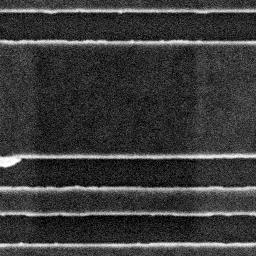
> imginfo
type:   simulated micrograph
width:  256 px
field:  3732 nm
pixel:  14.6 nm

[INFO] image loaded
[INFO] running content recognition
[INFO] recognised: lines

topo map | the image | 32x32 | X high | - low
XXXXXXXXXXXXXXXXXXXXXXXXXXXXXXXX
-----XX-------X----X----XXX-----
--------------------------------
--------------------------------
--------------------------------
XXXXXXXXXXXXXXXXXXXXXXXXXXXXXXXX
XXXXXXXXXXXXXXXXXXXXXXXXXXXXXXXX
XXXXXXXXXXXXXXXXXXXXXXXXXXXXXXXX
XXXXXXXXXXXXXXXXXXXXXXXXXXXXXXXX
XXXXXXXXXXXXXXXXXXXXXXXXXXXXXXXX
XXXXXXXXXXXXXXXXXXXXXXXXXXXXXXXX
XXXXXXXXXXXXXXXXXXXXXXXXXXXXXXXX
XXXXXXXXXXXXXXXXXXXXXXXXXXXXXXXX
XXXXXXXXXXXXXXXXXXXXXXXXXXXXXXXX
XXXXXXXXXXXXXXXXXXXXXXXXXXXXXXXX
XXXXXXXXXXXXXXXXXXXXXXXXXXXXXXXX
XXXXXXXXXXXXXXXXXXXXXXXXXXXXXXXX
XXXXXXXXXXXXXXXXXXXXXXXXXXXXXXXX
XXXXXXXXXXXXXXXXXXXXXXXXXXXXXXXX
XXXXXXXXXXXXXXXXXXXXXXXXXXXXXXXX
XX------------------------------
--------------------------------
--------------------------------
--------XXX--------------------X
XXXXXXXXXXXXXXXXXXXXXXXXXXXXXXXX
XXXXXXXXXXXXXXXXXXXXXXXXXXXXXXXX
XXXXXXXXXXXXXXXXXXXXXXXXXXXXXXXX
--------------------------------
--------------------------------
--------------------------------
--X----X----------XXXXXX-XXX-XXX
XXXXXXXXXXXXXXXXXXXXXXXXXXXXXXXX